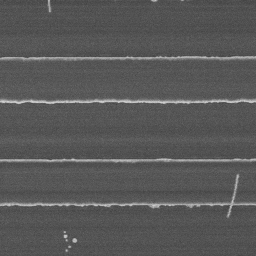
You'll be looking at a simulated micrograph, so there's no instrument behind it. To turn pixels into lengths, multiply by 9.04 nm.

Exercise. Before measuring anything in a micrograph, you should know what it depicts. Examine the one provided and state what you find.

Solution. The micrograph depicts lines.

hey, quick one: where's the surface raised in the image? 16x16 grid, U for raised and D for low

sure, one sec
DDDDDDDDDDDDDDDD
DDDDDDDDDDDDDDDD
DDDDDDDDDDDDDDDD
DDDDDDDDDDDDDDDD
UUUUUUUUUUUUUUUU
UUUUUUUUUUUUUUUU
DDDDDDDDDDDDDDDD
DDDDDDDDDDDDDDDD
DDDDDDDDDDDDDDDD
DDDDDDDDDDDDDDDD
UUUUUUUUUUUUUUUU
UUUUUUUUUUUUUUUU
UUUUUUUUUUUUUUUU
DDDDDDDDDDDDDDDD
DDDDDDDDDDDDDDDD
DDDDDDDDDDDDDDDD